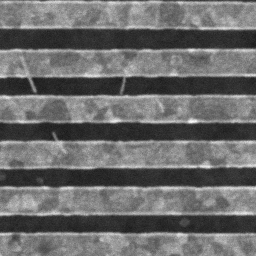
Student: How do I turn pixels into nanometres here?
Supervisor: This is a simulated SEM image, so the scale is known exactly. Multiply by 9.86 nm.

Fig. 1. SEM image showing lines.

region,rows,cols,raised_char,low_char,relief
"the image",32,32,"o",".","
oooooooooooooooooooooooooooooooo
oooooooooooooooooooooooooooooooo
oooooooooooooooooooooooooooooooo
...................o....oooooooo
................................
................................
oooooooooooooooooooooooooooooooo
oooooooooooooooooooooooooooooooo
oooooooooooooooooooooooooooooooo
oooooooooo.ooo.o..oo..o.........
................................
................................
oooooooooooooooooooooooooooooooo
oooooooooooooooooooooooooooooooo
oooooooooooooooooooooooooooooooo
................................
................................
................................
oooooooooooooooooooooooooooooooo
oooooooooooooooooooooooooooooooo
oooooooooooooooooooooooooooooooo
................................
................................
o.oooo..ooooooooo..oooo.....oooo
oooooooooooooooooooooooooooooooo
oooooooooooooooooooooooooooooooo
oooooooooooooooooooooooooooooooo
................................
................................
oooooooooooooooooooooooooooooooo
oooooooooooooooooooooooooooooooo
oooooooooooooooooooooooooooooooo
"